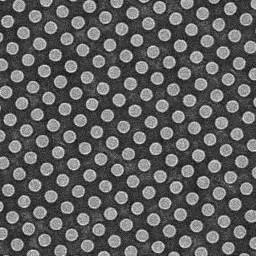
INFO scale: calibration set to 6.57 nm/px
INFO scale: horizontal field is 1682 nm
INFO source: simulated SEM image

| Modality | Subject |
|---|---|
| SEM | a regular array of raised bodies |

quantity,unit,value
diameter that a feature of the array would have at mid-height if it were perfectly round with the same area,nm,79.7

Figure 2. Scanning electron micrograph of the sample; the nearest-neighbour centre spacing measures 126 nm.